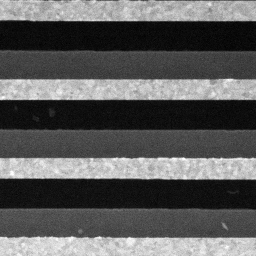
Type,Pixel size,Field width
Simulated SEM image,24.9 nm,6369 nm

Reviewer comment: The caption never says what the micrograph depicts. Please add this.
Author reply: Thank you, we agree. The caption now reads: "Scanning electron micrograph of lines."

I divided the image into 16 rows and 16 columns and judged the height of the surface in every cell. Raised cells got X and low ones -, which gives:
XXXXXXXXXXXXXXXX
----------------
----------------
XXXXXXXXXXXXXXXX
XXXXXXXXXXXXXXXX
XXXXXXXXXXXXXXXX
----------------
----------------
XXXXXXXXXXXXXXXX
XXXXXXXXXXXXXXXX
XXXXXXXXXXXXXXXX
----------------
----------------
XXXXXXXXXXXXXXXX
XXXXXXXXXXXXXXXX
XXXXXXXXXXXXXXXX